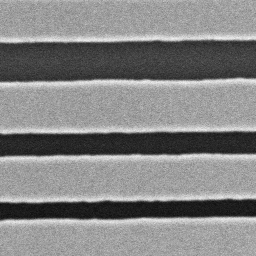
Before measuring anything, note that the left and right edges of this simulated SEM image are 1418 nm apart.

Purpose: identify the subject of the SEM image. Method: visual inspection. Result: lines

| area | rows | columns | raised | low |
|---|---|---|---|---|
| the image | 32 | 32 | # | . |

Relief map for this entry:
################################
################################
################################
################################
################################
................................
................................
................................
................................
................................
################################
################################
################################
################################
################################
################################
##############.##...............
................................
................................
......##########################
################################
################################
################################
################################
################################
................................
................................
....######.##..#################
################################
################################
################################
################################